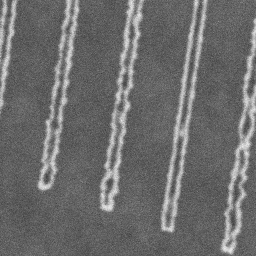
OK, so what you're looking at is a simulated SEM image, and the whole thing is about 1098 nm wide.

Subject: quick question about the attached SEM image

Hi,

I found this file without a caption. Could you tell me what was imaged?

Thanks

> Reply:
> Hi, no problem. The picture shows one or a few lines or trenches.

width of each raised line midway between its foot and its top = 45.6 nanometres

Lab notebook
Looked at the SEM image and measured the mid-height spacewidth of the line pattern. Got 0.228 µm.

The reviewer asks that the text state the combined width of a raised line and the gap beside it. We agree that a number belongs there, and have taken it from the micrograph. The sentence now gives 271 nanometers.